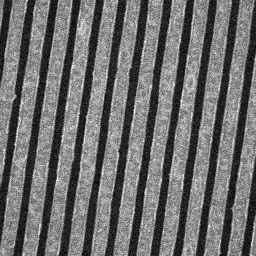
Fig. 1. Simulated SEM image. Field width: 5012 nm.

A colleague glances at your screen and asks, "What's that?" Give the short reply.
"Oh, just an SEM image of parallel lines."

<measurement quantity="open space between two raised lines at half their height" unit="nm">172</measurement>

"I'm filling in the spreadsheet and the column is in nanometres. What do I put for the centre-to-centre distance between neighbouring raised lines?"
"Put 441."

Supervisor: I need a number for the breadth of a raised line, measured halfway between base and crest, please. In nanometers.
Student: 267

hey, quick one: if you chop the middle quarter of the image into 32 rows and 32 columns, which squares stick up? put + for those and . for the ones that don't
..+++...+++..++++..+++...+++...+
..+++...+++...++...+++...+++...+
..+++..++++..+++...+++..++++..++
..+++..++++..+++...+++..++++..++
.++++..+++...+++...+++..++++..++
.++++..+++...+++...+++..++++..++
.+++...+++...+++..++++..+++...++
.+++...+++..++++..++++..+++...++
.+++...+++..++++..+++...+++...++
.+++..++++..+++...+++...+++..+++
.+++..++++..+++...+++...+++..+++
++++..+++...+++...+++...+++..+++
++++..+++...+++...+++..++++..+++
+++...+++...+++..++++..+++...+++
+++...+++..++++..+++...+++...+++
+++..++++..++++..+++...+++..++++
+++..++++..+++...+++...+++..++++
+++..++++..+++...+++...+++..++++
+++..+++...+++..++++..++++..+++.
+++..+++...+++..++++..+++...+++.
++...+++...+++..++++..+++...+++.
++...+++..+++...++++..+++...+++.
++...+++..++++..+++...+++...+++.
++..++++..++++..+++...+++..+++..
++..++++..+++...+++...+++..+++..
++..++++..+++..++++..+++...+++..
+...++++..+++..++++..+++...+++..
+...+++...+++..++++..+++...+++..
+...+++..++++..++++..+++..++++..
+...+++..++++..+++...+++...+++..
+..++++..+++...+++...+++..++++..
+..++++..+++...+++..++++..++++..